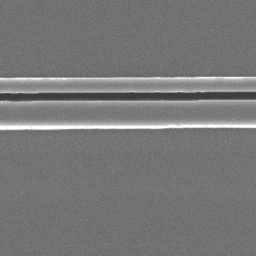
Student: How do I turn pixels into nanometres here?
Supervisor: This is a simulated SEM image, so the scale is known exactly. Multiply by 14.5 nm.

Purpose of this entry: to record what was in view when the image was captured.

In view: lines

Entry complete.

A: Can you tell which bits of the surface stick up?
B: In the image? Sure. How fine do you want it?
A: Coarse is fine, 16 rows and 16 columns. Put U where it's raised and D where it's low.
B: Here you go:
DDDDDDDDDDDDDDDD
DDDDDDDDDDDDDDDD
DDDDDDDDDDDDDDDD
DDDDDDDDDDDDDDDD
DDDDDDDDDDDDDDDD
UUUUUUUUUUUUUUUU
UUUUUUUUUUUUUUUU
UUUUUUUUUUUUUUUU
DDDDDDDDDDDDDDDD
DDDDDDDDDDDDDDDD
DDDDDDDDDDDDDDDD
DDDDDDDDDDDDDDDD
DDDDDDDDDDDDDDDD
DDDDDDDDDDDDDDDD
DDDDDDDDDDDDDDDD
DDDDDDDDDDDDDDDD